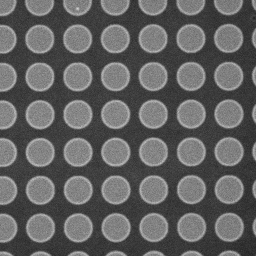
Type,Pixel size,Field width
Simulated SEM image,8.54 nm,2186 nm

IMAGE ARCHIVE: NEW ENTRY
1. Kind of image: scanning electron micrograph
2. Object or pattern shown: an array of small figures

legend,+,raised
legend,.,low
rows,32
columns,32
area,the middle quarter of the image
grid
.+++++....+++++.....+++++....+++
++++++....++++++...++++++....+++
+++++++..+++++++...+++++++..++++
+++++++..+++++++...+++++++..++++
+++++++...++++++...+++++++...+++
.+++++....++++++...++++++....+++
..+++.......++.......+++.......+
................................
................................
..+++......++++.....++++......++
.+++++....++++++....+++++....+++
+++++++...++++++...+++++++..++++
+++++++..+++++++...+++++++..++++
+++++++...++++++...+++++++..++++
+++++++...++++++...++++++....+++
.+++++.....++++.....++++......++
................................
................................
...............................+
.+++++....+++++.....+++++....+++
+++++++...++++++...+++++++...+++
+++++++..+++++++...+++++++..++++
+++++++..+++++++...+++++++..++++
+++++++...++++++...+++++++...+++
.+++++....++++++....+++++....+++
................................
................................
................................
..+++......++++.....++++......++
.+++++....++++++....+++++....+++
+++++++...++++++...+++++++..++++
+++++++..++++++++..+++++++..++++